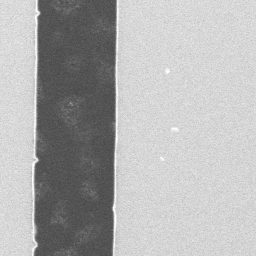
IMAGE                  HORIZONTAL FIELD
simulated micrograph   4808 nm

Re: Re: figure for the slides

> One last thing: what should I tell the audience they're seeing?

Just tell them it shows one or a few lines or trenches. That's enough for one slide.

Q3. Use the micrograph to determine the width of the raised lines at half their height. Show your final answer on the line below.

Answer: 82.1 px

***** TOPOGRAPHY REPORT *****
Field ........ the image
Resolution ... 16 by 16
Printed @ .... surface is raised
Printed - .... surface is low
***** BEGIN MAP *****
--@@@@@---------
--@@@@@---------
--@@@@@---------
--@@@@@---------
--@@@@@---------
--@@@@@---------
--@@@@@---------
--@@@@@---------
--@@@@@---------
--@@@@@---------
--@@@@@---------
--@@@@@---------
--@@@@@---------
--@@@@@---------
--@@@@@---------
--@@@@@---------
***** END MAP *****